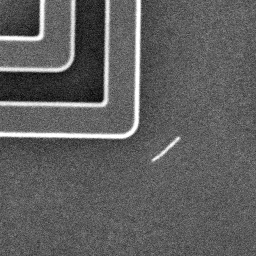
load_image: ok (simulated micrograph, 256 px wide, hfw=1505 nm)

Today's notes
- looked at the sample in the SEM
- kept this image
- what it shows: groups of lines, slits or small figures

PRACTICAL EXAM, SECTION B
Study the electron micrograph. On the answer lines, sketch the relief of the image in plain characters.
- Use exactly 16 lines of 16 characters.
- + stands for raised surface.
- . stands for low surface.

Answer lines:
...++..++.......
...++..++.......
+++++..++.......
+++++..++.......
.......++.......
.......++.......
+++++.+++.......
+++++++++.......
....++++........
................
................
................
................
................
................
................